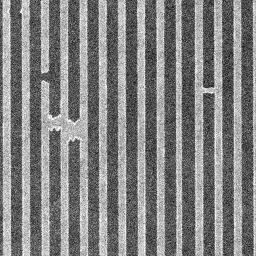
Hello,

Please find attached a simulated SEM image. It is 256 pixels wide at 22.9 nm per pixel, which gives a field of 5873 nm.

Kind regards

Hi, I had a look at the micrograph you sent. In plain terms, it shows parallel lines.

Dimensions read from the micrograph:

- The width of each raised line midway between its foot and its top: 295 nm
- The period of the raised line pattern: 441 nm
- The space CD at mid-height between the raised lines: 0.149 microns